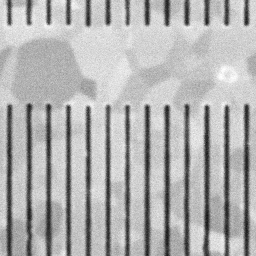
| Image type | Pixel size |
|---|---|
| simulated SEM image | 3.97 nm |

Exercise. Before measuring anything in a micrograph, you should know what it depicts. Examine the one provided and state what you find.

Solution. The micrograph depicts parallel lines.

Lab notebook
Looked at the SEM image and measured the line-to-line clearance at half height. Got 0.0213 um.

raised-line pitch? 78.3 nanometres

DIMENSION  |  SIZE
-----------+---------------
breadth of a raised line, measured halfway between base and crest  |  57.1 nanometres